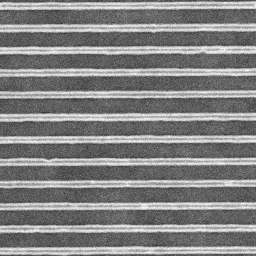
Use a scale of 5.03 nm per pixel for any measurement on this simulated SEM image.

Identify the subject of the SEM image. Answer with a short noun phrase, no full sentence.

parallel lines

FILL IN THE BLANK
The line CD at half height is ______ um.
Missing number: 0.0264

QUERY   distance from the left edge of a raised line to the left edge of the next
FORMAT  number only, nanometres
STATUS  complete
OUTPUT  112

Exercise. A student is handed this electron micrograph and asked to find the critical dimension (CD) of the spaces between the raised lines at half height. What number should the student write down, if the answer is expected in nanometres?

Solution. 83